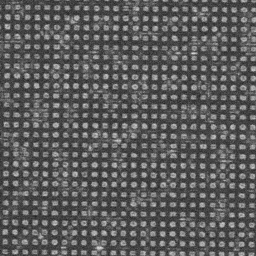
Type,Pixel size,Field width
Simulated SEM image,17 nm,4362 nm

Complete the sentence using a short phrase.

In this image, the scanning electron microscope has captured a regular array of raised bodies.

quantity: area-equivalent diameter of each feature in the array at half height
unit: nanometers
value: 76.9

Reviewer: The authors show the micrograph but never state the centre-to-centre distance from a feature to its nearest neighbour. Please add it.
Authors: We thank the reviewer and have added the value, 162 nm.